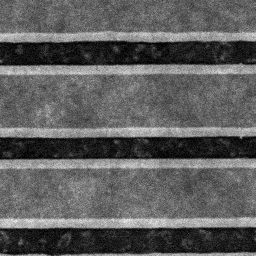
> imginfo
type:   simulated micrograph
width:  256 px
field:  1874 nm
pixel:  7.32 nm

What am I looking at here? one or a few lines or trenches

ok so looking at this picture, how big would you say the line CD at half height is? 449 nm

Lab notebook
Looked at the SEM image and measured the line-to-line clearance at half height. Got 0.229 microns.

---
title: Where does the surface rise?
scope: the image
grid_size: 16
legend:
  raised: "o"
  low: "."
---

oooooooooooooooo
oooooooooooooooo
................
................
oooooooooooooooo
oooooooooooooooo
oooooooooooooooo
oooooooooooooooo
................
................
oooooooooooooooo
oooooooooooooooo
oooooooooooooooo
oooooooooooooooo
................
................